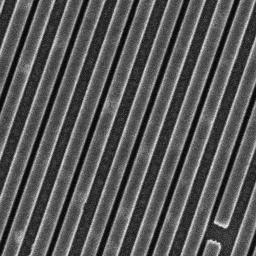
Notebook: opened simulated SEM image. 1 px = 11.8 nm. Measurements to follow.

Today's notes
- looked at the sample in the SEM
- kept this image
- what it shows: parallel lines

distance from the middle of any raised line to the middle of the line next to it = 0.28 um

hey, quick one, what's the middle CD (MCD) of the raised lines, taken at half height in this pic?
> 168 nanometres